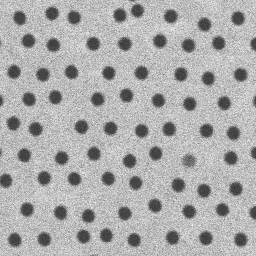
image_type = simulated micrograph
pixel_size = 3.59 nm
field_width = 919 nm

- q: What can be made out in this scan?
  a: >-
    a regular array of holes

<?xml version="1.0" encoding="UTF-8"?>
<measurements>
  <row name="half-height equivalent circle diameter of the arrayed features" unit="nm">45.9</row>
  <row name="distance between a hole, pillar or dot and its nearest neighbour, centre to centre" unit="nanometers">97.3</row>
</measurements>